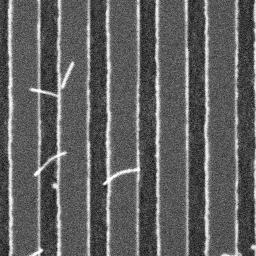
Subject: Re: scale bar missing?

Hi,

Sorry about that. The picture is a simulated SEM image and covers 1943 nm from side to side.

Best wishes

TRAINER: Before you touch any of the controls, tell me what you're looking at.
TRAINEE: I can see lines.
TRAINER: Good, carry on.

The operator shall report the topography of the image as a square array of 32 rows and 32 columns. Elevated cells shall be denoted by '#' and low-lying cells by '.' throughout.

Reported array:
.####..####..####...###...####..
.####..####..####...###...####..
.####..####..####...###...####..
.####..####..####...###...####..
.####..####..####...###...####..
.####..####..####...###...####..
.####..####..####...###...####..
.####..####..####...###...####..
.####..####..####...###...####..
.####..####..####...###...####..
.####..####..####...###...####..
.####..####..####...###...####..
.####..####..####...###...####..
.####..####..####...###...####..
.####..####...###...###...####..
.####..####..####...###...####..
.####..####..####...###...####..
.####..####..####...###...####..
.####..####..####...###...####..
.####..####..####...###...####..
.####..####..####...###...####..
.####..####..####...###...####..
.####..####..####...###...####..
.####..####..####...###...####..
.####..####..####...###...####..
.####..####..####...###...####..
.####..####..####...###...####..
.####..####..####...###...####..
.####..####..####...###...####..
.####..####..####...###...####..
.####..####..####...###...####..
.####..####..####...###...####..